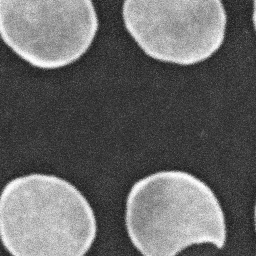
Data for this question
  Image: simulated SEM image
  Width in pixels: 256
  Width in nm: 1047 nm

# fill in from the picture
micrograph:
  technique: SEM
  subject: raised bodies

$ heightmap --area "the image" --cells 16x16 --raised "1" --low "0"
1111110011111100
1111110011111100
1111110001111100
0011100000111000
0000000000000000
0000000000000000
0000000000000000
0000000000000000
0000000000000000
0000000000000000
0000000000000000
0111000001110000
1111100011111000
1111110011111100
1111110011111100
0111100001110000